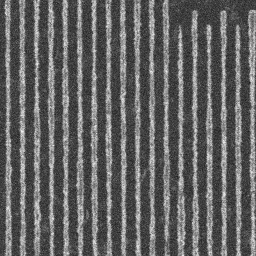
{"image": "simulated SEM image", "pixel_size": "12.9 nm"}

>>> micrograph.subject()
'parallel lines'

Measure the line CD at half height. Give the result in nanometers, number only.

45.1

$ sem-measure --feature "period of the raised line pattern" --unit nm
185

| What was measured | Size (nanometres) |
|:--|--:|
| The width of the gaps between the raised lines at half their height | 146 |